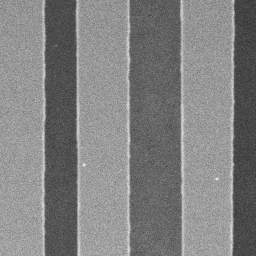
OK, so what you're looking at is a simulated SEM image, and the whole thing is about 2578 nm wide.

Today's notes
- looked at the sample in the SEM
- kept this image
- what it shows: lines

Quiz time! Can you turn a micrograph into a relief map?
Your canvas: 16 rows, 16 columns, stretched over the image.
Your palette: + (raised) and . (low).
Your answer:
+++..+++...++++.
+++..+++...++++.
+++..+++...++++.
+++..+++...++++.
+++..+++...++++.
+++..+++...++++.
+++..+++...++++.
+++..+++...++++.
+++..+++...++++.
+++..+++...++++.
+++..+++...++++.
+++..+++...++++.
+++..+++...++++.
+++..+++...++++.
+++..+++...++++.
+++..+++...++++.